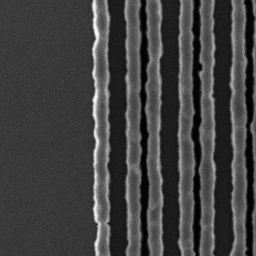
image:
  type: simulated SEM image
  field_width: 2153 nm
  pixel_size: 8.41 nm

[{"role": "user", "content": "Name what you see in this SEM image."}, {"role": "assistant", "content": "parallel lines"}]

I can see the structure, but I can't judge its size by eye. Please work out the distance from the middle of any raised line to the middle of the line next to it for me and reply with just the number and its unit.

0.231 micrometres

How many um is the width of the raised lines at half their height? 0.114